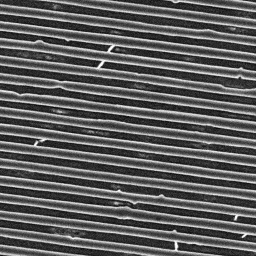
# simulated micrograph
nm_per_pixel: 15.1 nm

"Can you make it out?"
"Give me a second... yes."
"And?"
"parallel lines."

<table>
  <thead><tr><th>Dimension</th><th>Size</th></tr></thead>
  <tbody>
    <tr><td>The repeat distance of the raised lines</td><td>257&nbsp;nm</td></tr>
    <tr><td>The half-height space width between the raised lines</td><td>118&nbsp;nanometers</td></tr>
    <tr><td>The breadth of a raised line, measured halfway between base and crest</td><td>8.68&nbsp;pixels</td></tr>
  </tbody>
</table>